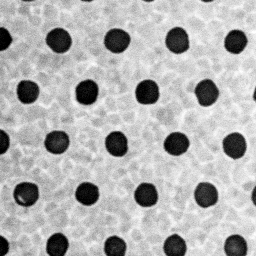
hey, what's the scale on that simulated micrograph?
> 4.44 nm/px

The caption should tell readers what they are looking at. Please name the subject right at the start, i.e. a regular array of holes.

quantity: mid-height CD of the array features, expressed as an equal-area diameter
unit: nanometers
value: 117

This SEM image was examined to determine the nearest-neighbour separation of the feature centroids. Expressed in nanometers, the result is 258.